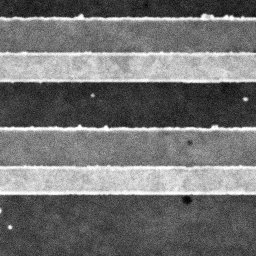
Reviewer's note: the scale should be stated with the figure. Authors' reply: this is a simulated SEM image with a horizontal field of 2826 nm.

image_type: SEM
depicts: lines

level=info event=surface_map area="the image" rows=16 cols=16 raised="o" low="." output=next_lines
................
oooooooooooooooo
oooooooooooooooo
oooooooooooooooo
oooooooooooooooo
................
................
................
oooooooooooooooo
oooooooooooooooo
oooooooooooooooo
oooooooooooooooo
................
................
................
................